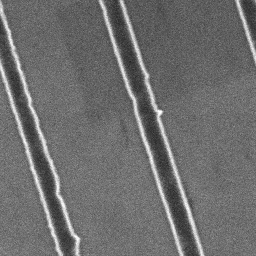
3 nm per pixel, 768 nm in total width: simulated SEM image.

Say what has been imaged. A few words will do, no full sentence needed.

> one or a few lines or trenches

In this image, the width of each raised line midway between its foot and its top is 0.0604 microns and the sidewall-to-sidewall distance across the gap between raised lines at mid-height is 0.29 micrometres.